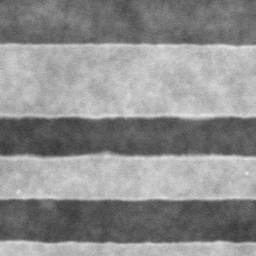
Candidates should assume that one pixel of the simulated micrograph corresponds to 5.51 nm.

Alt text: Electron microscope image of lines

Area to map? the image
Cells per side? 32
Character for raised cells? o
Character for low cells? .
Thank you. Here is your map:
................................
................................
................................
................................
................................
................................
oooooooooooooooooooooooooooooooo
oooooooooooooooooooooooooooooooo
oooooooooooooooooooooooooooooooo
oooooooooooooooooooooooooooooooo
oooooooooooooooooooooooooooooooo
oooooooooooooooooooooooooooooooo
oooooooooooooooooooooooooooooooo
oooooooooooooooooooooooooooooooo
.ooooooooooooooooooo..ooooo..ooo
................................
................................
................................
................................
..........ooooo.................
oooooooooooooooooooooooooooooooo
oooooooooooooooooooooooooooooooo
oooooooooooooooooooooooooooooooo
oooooooooooooooooooooooooooooooo
oooooooooooooooooooooooooooooooo
................................
................................
................................
................................
................................
ooooooooooooooo.oooooooooooooooo
oooooooooooooooooooooooooooooooo